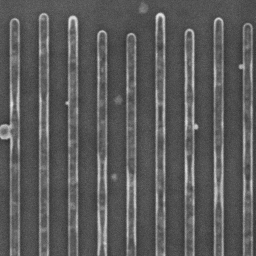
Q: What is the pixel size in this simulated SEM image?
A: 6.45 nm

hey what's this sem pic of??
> groups of lines, slits or small figures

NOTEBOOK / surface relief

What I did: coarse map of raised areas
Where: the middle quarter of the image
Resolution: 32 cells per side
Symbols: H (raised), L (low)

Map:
LHHLLLLLLHHLLLLLHHLLLLLHHLLLLLHH
LHHLLLLLLHHLLLLLHHLLLLLHHLLLLLHH
LHHLLLLLLHHLLLLLHHLLLLLHHLLLLLHH
LHHLLLLLLHHLLLLLHHLLLLLHHLLLLLHH
LHHLLLLLLHHLLLLLHHLLLLLHHLLLLLHH
LHHLLLLLLHHLLLLLHHLLLLLHHLLLLLHH
LHHLLLLLLHHLLLLLHHLLLLLHHLLLLLHH
LHHLLLLLLHHLLLLLHHLLLLLHHLLLLLHH
LHHLLLLLLHHLLLLLHHLLLLLHHLLLLLHH
LHHLLLLLLHHLLLLLHHLLLLLHHLLLLLHH
LHHLLLLLLHHLLLLLHHLLLLLHHLLLLLHH
LHHLLLLLLHHLLLLLHHLLLLLHHLLLLLLH
LHHLLLLLLHHLLLLLHHLLLLLHHLLLLLLH
LHHLLLLLLHHLLLLLHHLLLLLHHLLLLLLH
LHHLLLLLLHHLLLLLHHLLLLLHHLLLLLLH
LHHLLLLLLHHLLLLLHHLLLLLHHLLLLLHH
LHHLLLLLLHHLLLLLHHLLLLLHHLLLLLHH
LHHLLLLLLHHLLLLLHHLLLLLHHLLLLLHH
LHHLLLLLLHHLLLLLHHLLLLLHHLLLLLHH
LHHLLLLLLHHLLLLLHHLLLLLHHLLLLLHH
LHHLLLLLLHHLLLLLHHLLLLLHHLLLLLHH
LHHLLLLLLHHLLLLLHHLLLLLHHLLLLLHH
LHHLLLLLLHHLLLLLHHLLLLLHHLLLLLHH
LHHLLLLLLHLLLLLLHHLLLLLHHLLLLLHH
LHHLLLLLLHLLLLLLHHLLLLLHHLLLLLHH
LHHLLLLLLHLLLLLLHHLLLLLHHLLLLLHH
LHHLLLLLLHLLLLLLHHLLLLLHHLLLLLLH
LHHLLLLLLHLLLLLLHHLLLLLHHLLLLLLH
LHHLLLLLLHLLLLLLHHLLLLLHHLLLLLHH
LHHLLLLLLHLLLLLLHHLLLLLHHLLLLLHH
LHHLLLLLLHLLLLLLHHLLLLLHHLLLLLHH
LHHLLLLLLHLLLLLLHHLLLLLHHLLLLLHH